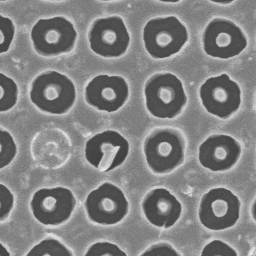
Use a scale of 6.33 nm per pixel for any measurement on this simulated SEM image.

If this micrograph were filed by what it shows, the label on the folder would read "a regular array of ring-shaped grooves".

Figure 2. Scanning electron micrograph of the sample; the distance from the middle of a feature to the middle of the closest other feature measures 350 nanometers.